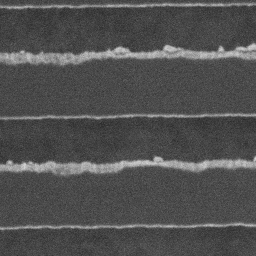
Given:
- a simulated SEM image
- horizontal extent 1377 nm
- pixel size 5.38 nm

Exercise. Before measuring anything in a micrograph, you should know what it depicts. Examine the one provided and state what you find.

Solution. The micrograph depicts lines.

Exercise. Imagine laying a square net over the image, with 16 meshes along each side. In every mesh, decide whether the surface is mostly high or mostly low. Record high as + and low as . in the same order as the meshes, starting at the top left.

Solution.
++..............
................
................
.....+++++++++++
++++++++++++++++
++++++++++++++++
++++++++++++++++
................
................
................
++++++++++++++++
++++++++++++++++
++++++++++++++++
++++++++++++++++
................
................